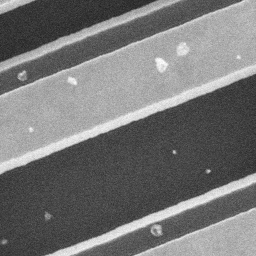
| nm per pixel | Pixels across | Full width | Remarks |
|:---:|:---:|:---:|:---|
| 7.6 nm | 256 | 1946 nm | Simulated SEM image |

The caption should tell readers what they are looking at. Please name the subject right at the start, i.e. lines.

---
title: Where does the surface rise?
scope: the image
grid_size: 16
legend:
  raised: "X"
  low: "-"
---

----------XXXXXX
-------XXXXXXXXX
----XXXXXXXXXXXX
--XXXXXXXXXXXXXX
XXXXXXXXXXXXXXX-
XXXXXXXXXXXXX---
XXXXXXXXXX------
XXXXXXXX--------
XXXXX-----------
XX--------------
----------------
---------------X
-------------XXX
----------XXXXXX
--------XXXXXXXX
-----XXXXXXXXXXX